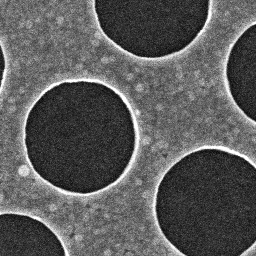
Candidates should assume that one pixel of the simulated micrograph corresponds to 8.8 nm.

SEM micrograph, holes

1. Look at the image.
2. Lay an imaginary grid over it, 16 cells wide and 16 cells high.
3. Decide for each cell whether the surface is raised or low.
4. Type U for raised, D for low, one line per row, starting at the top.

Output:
UUUUUUDDDDDDDUUU
UUUUUUDDDDDDDUUU
UUUUUUUDDDDDUUUD
UUUUUUUUUDUUUUDD
UUUUUUUUUUUUUUDD
UUUDDDDUUUUUUUDD
UUDDDDDDUUUUUUUD
UUDDDDDDUUUUUUUU
UUDDDDDDDUUUUUUU
UUDDDDDDUUUUDDUU
UUDDDDDDUUUDDDDD
UUUDDDDUUUDDDDDD
UUUUUUUUUUDDDDDD
DDUUUUUUUUDDDDDD
DDDUUUUUUUDDDDDD
DDDDUUUUUUUDDDDD